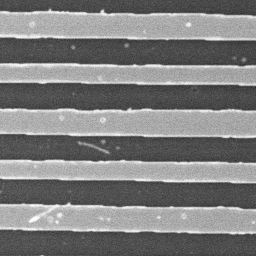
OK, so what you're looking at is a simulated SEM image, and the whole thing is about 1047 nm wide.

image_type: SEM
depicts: lines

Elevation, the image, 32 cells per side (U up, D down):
DDDDDDDDDDDDDDDDDDDDDDDDDDDDDDDD
DDDDDDDDDDDDDDDDDDDDDDDDDDDDDDDD
UUUUUUUUUUUUUUUUUUUUUUUUUUUUUUUU
UUUUUUUUUUUUUUUUUUUUUUUUUUUUUUUU
UUUUUUUUUUUUUUUUUUUUUUUUUUUUUUUU
DDDDDDDDDDDDDDDDDDDDDDDDDDDDDDDD
DDDDDDDDDDDDDDDDDDDDDDDDDDDDDDDD
DDDDDDDDDDDDDDDDDDDDDDDDDDDDDDDD
UUUUUUUUUUUUUUUUUUUUUUUUUUUUUUUU
UUUUUUUUUUUUUUUUUUUUUUUUUUUUUUUU
DDDDDDDDDDDDDDDDDDDDDDDDDDDDDDUU
DDDDDDDDDDDDDDDDDDDDDDDDDDDDDDDD
DDDDDDDDDDDDDDDDDDDDDDDDDDDDDDDD
DDDDDDDDDDDDDDDDDDDDDDDDDDDDDDDD
UUUUUUUUUUUUUUUUUUUUUUUUUUUUUUUU
UUUUUUUUUUUUUUUUUUUUUUUUUUUUUUUU
UUUUUUUUUUUUUUUUUUUUUUUUUUUUUUUU
DDDDDDDDDDDDDDDDDDDDDDDDDDDDDDDD
DDDDDDDDDDDDDDDDDDDDDDDDDDDDDDDD
DDDDDDDDDDDDDDDDDDDDDDDDDDDDDDDD
UUUUUUUUUUUUUUUUUUUUUUUUUUUUUUUU
UUUUUUUUUUUUUUUUUUUUUUUUUUUUUUUU
DDDDDDDDDDDDDDDDDUUUUUUUUUUUUUUU
DDDDDDDDDDDDDDDDDDDDDDDDDDDDDDDD
DDDDDDDDDDDDDDDDDDDDDDDDDDDDDDDD
DDDDDDDDDDDDDDDDDDDDDDDDDDDDDDDD
UUUUUUUUUUUUUUUUUUUUUUUUUUUUUUUU
UUUUUUUUUUUUUUUUUUUUUUUUUUUUUUUU
UUUUUUUUUUUUUUUUUUUUUUUUUUUUUUUU
DDDDDDDDDDDDDDDDDDDDDDDDDDDDDDDD
DDDDDDDDDDDDDDDDDDDDDDDDDDDDDDDD
DDDDDDDDDDDDDDDDDDDDDDDDDDDDDDDD